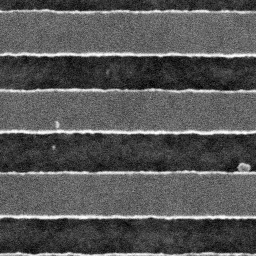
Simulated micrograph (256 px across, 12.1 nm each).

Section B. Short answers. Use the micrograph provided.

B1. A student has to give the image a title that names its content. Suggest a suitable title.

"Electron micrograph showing lines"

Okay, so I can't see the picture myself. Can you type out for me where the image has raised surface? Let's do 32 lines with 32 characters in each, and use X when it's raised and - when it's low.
--------------------------------
XXXXXXXXXXXXXXXXXXXXXXXXXXXXXXXX
XXXXXXXXXXXXXXXXXXXXXXXXXXXXXXXX
XXXXXXXXXXXXXXXXXXXXXXXXXXXXXXXX
XXXXXXXXXXXXXXXXXXXXXXXXXXXXXXXX
XXXXXXXXXXXXXXXXXXXXXXXXXXXXXXXX
XXXXXXXXXXXXXXXXXXXXXXXXXXXXXXXX
--------------------------------
--------------------------------
--------------------------------
--------------------------------
XXXXXXXXXXXXXXXXXXXXXXXXXXXXXXXX
XXXXXXXXXXXXXXXXXXXXXXXXXXXXXXXX
XXXXXXXXXXXXXXXXXXXXXXXXXXXXXXXX
XXXXXXXXXXXXXXXXXXXXXXXXXXXXXXXX
XXXXXXXXXXXXXXXXXXXXXXXXXXXXXXXX
XXXXXXX-XXXXXXXXXXXXXXXXXXXXXXXX
--------------------------------
--------------------------------
--------------------------------
--------------------------------
----------------------XXX-------
XXXXXXXXXXXXXXXXXXXXXXXXXXXXXXXX
XXXXXXXXXXXXXXXXXXXXXXXXXXXXXXXX
XXXXXXXXXXXXXXXXXXXXXXXXXXXXXXXX
XXXXXXXXXXXXXXXXXXXXXXXXXXXXXXXX
XXXXXXXXXXXXXXXXXXXXXXXXXXXXXXXX
--------------------------------
--------------------------------
--------------------------------
--------------------------------
--------------------------------